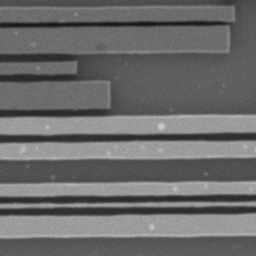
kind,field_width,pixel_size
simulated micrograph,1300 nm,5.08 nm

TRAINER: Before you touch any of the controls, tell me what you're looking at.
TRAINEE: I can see groups of lines, slits or small figures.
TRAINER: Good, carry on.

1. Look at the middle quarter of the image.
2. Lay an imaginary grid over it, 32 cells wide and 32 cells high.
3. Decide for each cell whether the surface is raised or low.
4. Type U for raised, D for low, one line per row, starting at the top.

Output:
UUUDDDDDDDDDDDDDDDDDDDDDDDDDDDDD
UUUDDDDDDDDDDDDDDDDDDDDDDDDDDDDD
DDDDDDDDDDDDDDDDDDDDDDDDDDDDDDDD
DDDDDDDDDDDDDDDDDDDDDDDDDDDDDDDD
UUUUUUUUUUUDDDDDDDDDDDDDDDDDDDDD
UUUUUUUUUUUDDDDDDDDDDDDDDDDDDDDD
UUUUUUUUUUUDDDDDDDDDDDDDDDDDDDDD
UUUUUUUUUUUDDDDDDDDDDDDDDDDDDDDD
UUUUUUUUUUUDDDDDDDDDDDDDDDDDDDDD
UUUUUUUUUUUDDDDDDDDDDDDDDDDDDDDD
UUUUUUUUUUUDDDDDDDDDDDDDDDDDDDDD
DDDDDDDDDDDDDDDDDDDDDDDDDDDDDDDD
DDDDDDDDDDDDDDDDDDDDDDDDDDDDDDDD
UUUUUUUUUUUUUUUUUUUUUUUUUUUUUUUU
UUUUUUUUUUUUUUUUUUUUUUUUUUUUUUUU
UUUUUUUUUUUUUUUUUUUUUUUUUUUUUUUU
UUUUUUUUUUUUUUUUUUUUUUUUUUUUUUUU
DDDDDDDDDDDDDDDDDDDDDDDDDDDDDDDD
DDDDDDDDDDDDDDDDDDDDDDDDDDDDDDDD
DDDDDDDDDDDDDDDDDDDUUUUUUUUUUUUU
UUUUUUUUUUUUUUUUUUUUUUUUUUUUUUUU
UUUUUUUUUUUUUUUUUUUUUUUUUUUUUUUU
UUUUUUUUUUUUUUUUUUUUUUUUUUUUUUUU
UUUUUDDDDDDDDDDDDDDDDDDUUUDDDDDD
DDDDDDDDDDDDDDDDDDDDDDDDDDDDDDDD
DDDDDDDDDDDDDDDDDDDDDDDDDDDDDDDD
DDDDDDDDDDDDDDDDDDDDDDDDDDDDDDDD
DDDDDDDDDDDDDDDDDDDDDDDDDDDDDDDD
DDDDDDDDDDDDDDDDDDDDDDDDDDDDDDDD
DDDDDDDDDDDDDDDDDDDDDDDDDDDDDDDD
UUUUUUUUUUUUUUUUUUUUUUUUUUUUUUUU
UUUUUUUUUUUUUUUUUUUUUUUUUUUUUUUU